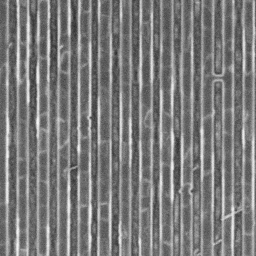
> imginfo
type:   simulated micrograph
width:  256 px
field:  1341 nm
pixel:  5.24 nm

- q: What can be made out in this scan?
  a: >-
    parallel lines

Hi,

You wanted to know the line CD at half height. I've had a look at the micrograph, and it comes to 63.5 nanometres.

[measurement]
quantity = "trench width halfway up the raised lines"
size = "43.9 nm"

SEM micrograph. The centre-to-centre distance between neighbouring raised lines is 107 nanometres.